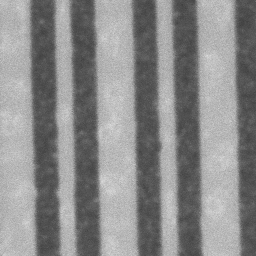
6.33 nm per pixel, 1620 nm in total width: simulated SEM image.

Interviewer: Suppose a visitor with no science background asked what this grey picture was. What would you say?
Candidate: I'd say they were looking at parallel lines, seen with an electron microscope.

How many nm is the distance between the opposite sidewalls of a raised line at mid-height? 176